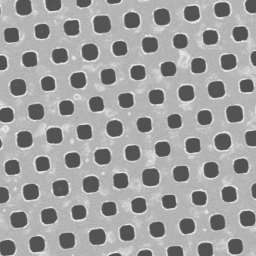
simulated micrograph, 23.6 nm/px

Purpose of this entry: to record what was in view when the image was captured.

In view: a regular array of holes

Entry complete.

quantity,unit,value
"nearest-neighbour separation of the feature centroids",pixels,30.1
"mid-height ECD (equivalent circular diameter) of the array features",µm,0.388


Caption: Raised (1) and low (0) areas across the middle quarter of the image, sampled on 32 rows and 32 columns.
11111111111111111000111100001111
11111111110011111000111100001111
11000111100001111000111100001111
10000111100001111000111111111111
11000011100001111111111111111111
11000111111111111111111111111000
11111111111111111111110011111000
11111111111111000111100001110000
11111110011111000111100001111000
00111100001111000011100001111111
00011100001111000111111111111111
00011110001111111111111111111111
00111111111111111111111111101111
11111111111111111110011111000111
11111111111000111100001111000111
11100001111000011100001111000111
11100001110000011110001111111111
11100001111000111111111111111111
11110001111111111111111111111110
11111111111111111111111100111100
11111111111111110011111000011100
11111111000111100001111000011100
10001111000011100001111000111111
00001111000011100001111111111111
00001111000111111111111111111111
10001111111111111111111111110011
11111111111111111111000111100001
11111111111110001110000011100001
11111000111100001110000011100001
01111000011100001111000011111111
01111000011110001111100111111111
01111000011111111111111111111111